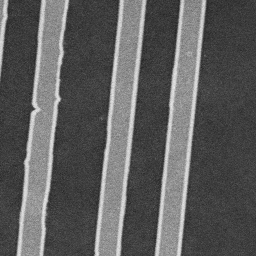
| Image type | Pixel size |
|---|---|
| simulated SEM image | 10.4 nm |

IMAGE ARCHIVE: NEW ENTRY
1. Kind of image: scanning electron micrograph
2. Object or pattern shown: one or a few lines or trenches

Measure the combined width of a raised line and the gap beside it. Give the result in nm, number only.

712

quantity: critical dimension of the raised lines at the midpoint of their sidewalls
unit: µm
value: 0.228